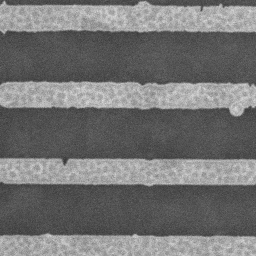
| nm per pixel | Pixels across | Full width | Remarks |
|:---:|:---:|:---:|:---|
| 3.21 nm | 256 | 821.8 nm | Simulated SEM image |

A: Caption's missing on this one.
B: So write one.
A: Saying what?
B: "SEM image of one or a few lines or trenches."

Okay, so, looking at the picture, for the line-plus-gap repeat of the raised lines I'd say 0.246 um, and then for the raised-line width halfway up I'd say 78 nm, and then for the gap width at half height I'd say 168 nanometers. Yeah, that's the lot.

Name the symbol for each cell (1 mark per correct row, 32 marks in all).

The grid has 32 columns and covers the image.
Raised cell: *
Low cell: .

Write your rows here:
.................**.............
********************************
********************************
********************************
................................
................................
................................
................................
................................
................................
*****************....***........
********************************
********************************
....................*****...***.
................................
................................
................................
................................
................................
................................
********************************
********************************
********************************
................................
................................
................................
................................
................................
................................
********........**..............
********************************
********************************